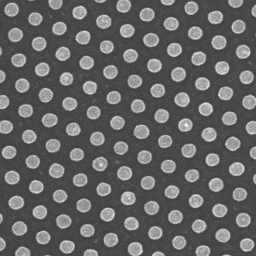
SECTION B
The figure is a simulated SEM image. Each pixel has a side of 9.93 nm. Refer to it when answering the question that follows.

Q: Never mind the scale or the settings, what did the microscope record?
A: a regular array of raised bodies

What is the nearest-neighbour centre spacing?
250 nanometers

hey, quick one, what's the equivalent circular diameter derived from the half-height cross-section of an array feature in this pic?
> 14 pixels